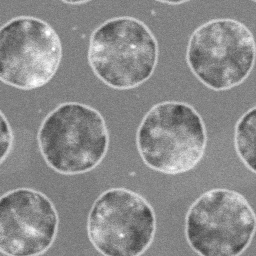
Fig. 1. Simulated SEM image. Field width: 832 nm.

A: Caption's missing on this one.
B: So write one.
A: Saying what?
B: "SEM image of holes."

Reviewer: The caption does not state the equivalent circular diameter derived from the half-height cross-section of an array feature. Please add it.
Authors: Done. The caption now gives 0.222 um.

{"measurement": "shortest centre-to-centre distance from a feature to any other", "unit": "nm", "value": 318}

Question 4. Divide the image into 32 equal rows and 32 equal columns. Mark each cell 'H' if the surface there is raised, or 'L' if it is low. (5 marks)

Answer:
HHHHHHHHHHHHHHHHHHHHHHHHHHHHHHHH
HHHHHHHHHHHHHHHHHHHHHHHHHHHHHHHH
HHLLLHHHHHHHHHLLLHHHHHHHHHHHHHHH
LLLLLLHHHHHHLLLLLLHHHHHHHLLLLLLH
LLLLLLLHHHHHLLLLLLLHHHHHLLLLLLLH
LLLLLLLHHHHLLLLLLLLHHHHHLLLLLLLL
LLLLLLLLHHHLLLLLLLLLHHHHLLLLLLLL
LLLLLLLHHHHLLLLLLLLHHHHHLLLLLLLL
LLLLLLLHHHHHLLLLLLLHHHHHLLLLLLLH
LLLLLLHHHHHHLLLLLLLHHHHHHLLLLLLH
HLLLLHHHHHHHHHLLLHHHHHHHHHLLLHHH
HHHHHHHHHHHHHHHHHHHHHHHHHHHHHHHH
HHHHHHHHHHHHHHHHHHHHHHHHHHHHHHHH
HHHHHHHLLLLHHHHHHHHLLLLLHHHHHHHH
HHHHHHLLLLLLHHHHHHLLLLLLLHHHHHLL
LHHHHLLLLLLLLHHHHHLLLLLLLHHHHHLL
LHHHHLLLLLLLLHHHHLLLLLLLLLHHHLLL
LHHHHLLLLLLLLHHHHLLLLLLLLLHHHLLL
LHHHHLLLLLLLLHHHHLLLLLLLLHHHHHLL
LHHHHHLLLLLLLHHHHHLLLLLLLHHHHHLL
HHHHHHLLLLLLHHHHHHLLLLLLHHHHHHHL
HHHHHHHLLLHHHHHHHHHHHLHHHHHHHHHH
HHHHHHHHHHHHHHHHHHHHHHHHHHHHHHHH
HHHHHHHHHHHHHHHHHHHHHHHHHHHHHHHH
LLLLLLHHHHHHHLLLLHHHHHHHHLLLLLHH
LLLLLLHHHHHHLLLLLLHHHHHHLLLLLLLH
LLLLLLLHHHHLLLLLLLLHHHHHLLLLLLLH
LLLLLLLHHHHLLLLLLLLHHHHLLLLLLLLL
LLLLLLLHHHHLLLLLLLLHHHHLLLLLLLLL
LLLLLLLHHHHLLLLLLLLHHHHLLLLLLLLH
LLLLLLHHHHHHLLLLLLLHHHHHLLLLLLLH
LLLLLHHHHHHHHLLLLLHHHHHHHLLLLLHH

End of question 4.